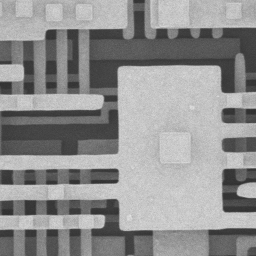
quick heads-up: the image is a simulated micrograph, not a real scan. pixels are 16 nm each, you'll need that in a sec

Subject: wiring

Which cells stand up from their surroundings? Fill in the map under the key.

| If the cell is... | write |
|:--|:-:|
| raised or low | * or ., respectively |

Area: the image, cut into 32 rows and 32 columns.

****************...*************
****************...*************
****************...*************
***************.................
******..........................
................................
................................
................................
***............************.....
***............*************....
...............*************....
...............*************....
*************..*****************
************...*************....
...............*************....
...............*****************
...............*****************
...............*************....
...............*************....
********************************
********************************
...............*************....
...............*************....
****************************..**
****************************..**
...............*************....
...............*************....
*************..*****************
*********.**...*************....
................................
................................
................................